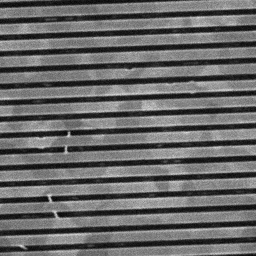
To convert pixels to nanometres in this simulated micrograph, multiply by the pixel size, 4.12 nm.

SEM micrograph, parallel lines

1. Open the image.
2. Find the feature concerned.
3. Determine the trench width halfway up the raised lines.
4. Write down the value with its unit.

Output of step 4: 6.38 px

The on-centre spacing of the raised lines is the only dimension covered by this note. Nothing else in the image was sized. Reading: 67.2 nm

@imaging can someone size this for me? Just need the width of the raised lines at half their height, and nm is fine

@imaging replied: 41.2